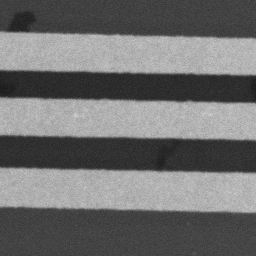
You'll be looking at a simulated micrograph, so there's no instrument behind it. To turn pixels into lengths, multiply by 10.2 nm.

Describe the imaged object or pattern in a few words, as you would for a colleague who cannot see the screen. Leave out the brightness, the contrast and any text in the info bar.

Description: lines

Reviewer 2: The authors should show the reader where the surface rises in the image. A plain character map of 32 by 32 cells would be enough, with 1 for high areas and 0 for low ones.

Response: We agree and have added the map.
00000000000000000000000000000000
00000000000000000000000000000000
00000000000000000000000000000000
00000000000000000000000000000000
11111111111110100000000000000000
11111111111111111111111111111111
11111111111111111111111111111111
11111111111111111111111111111111
11111111111111111111111111111111
00000000000000000000000000000000
00000000000000000000000000000000
00000000000000000000000000000000
11111111111100000000000000000000
11111111111111111111111111111111
11111111111111111111111111111111
11111111111111111111111111111111
11111111111111111111111111111111
00000000000000000000000000000000
00000000000000000000000000000000
00000000000000000000000000000000
00000000000000000000000000000000
11111111111111111111001000000000
11111111111111111111111111111111
11111111111111111111111111111111
11111111111111111111111111111111
11111111111111111111111111111111
00000000000000000000000000000000
00000000000000000000000000000000
00000000000000000000000000000000
00000000000000000000000000000000
00000000000000000000000000000000
00000000000000000000000000000000